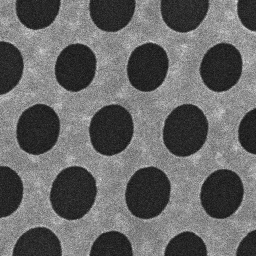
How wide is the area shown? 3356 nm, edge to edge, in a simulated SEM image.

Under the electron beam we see a regular array of holes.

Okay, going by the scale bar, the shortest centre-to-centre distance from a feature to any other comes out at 952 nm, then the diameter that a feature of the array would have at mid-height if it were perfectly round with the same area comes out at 624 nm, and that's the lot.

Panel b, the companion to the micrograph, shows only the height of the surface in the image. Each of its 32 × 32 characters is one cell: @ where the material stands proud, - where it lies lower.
@@------@@@------@@@------@@@@--
@@-----@@@@------@@@------@@@@--
@@-----@@@@-----@@@@-----@@@@@--
@@@---@@@@@@---@@@@@@----@@@@@@-
@@@@@@@@@@@@@@@@@@@@@@@@@@@@@@@@
-@@@@@@@@-@@@@@@@@--@@@@@@@--@@@
---@@@@@----@@@@@----@@@@@----@@
---@@@@-----@@@@-----@@@@-----@@
---@@@@-----@@@@-----@@@@-----@@
---@@@@-----@@@@-----@@@@-----@@
--@@@@@----@@@@@----@@@@@@---@@@
-@@@@@@@@@@@@@@@@@@@@@@@@@@@@@@@
@@@@@@@@@@@@@@@@@@@@@@@@@@@@@@@@
@@@@--@@@@@@@---@@@@@@---@@@@@@@
@@@----@@@@@----@@@@@-----@@@@@-
@@------@@@------@@@@-----@@@@--
@@-----@@@@------@@@------@@@@--
@@-----@@@@-----@@@@------@@@@--
@@@----@@@@@----@@@@@----@@@@@--
@@@@@@@@@@@@@@@@@@@@@@--@@@@@@@@
@@@@@@@@@@@@@@@@@@@@@@@@@@@@@@@@
--@@@@@----@@@@@@---@@@@@@@--@@@
---@@@@-----@@@@-----@@@@@----@@
---@@@------@@@@-----@@@@-----@@
---@@@------@@@@-----@@@@-----@@
---@@@------@@@@-----@@@@-----@@
--@@@@@----@@@@@----@@@@@@---@@@
@@@@@@@@@@@@@@@@@@@@@@@@@@@@@@@@
@@@@--@@@@@@@@@@@@@@@@@@@@@@@@@@
@@@----@@@@@----@@@@@@---@@@@@@-
@@------@@@@----@@@@@-----@@@@--
@@------@@@------@@@@-----@@@@--